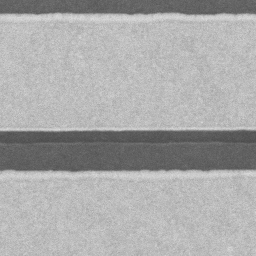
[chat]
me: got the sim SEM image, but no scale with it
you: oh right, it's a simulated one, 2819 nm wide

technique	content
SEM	lines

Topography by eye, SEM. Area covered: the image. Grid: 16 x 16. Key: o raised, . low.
................
oooooooooooooooo
oooooooooooooooo
oooooooooooooooo
oooooooooooooooo
oooooooooooooooo
oooooooooooooooo
oooooooooooooooo
................
................
................
oooooooooooooooo
oooooooooooooooo
oooooooooooooooo
oooooooooooooooo
oooooooooooooooo